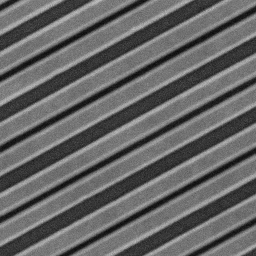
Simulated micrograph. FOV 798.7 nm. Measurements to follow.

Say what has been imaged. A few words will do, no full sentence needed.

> parallel lines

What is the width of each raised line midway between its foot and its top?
17.2 pixels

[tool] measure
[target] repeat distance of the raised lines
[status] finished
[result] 0.0963 microns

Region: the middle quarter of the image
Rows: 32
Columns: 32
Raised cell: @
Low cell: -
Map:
@---------@@@@@@@@@@----@@@@@@@@
---------@@@@@@@@@-----@@@@@@@@-
-------@@@@@@@@@-----@@@@@@@@---
-----@@@@@@@@@-----@@@@@@@@@----
---@@@@@@@@@-----@@@@@@@@@------
-@@@@@@@@@-----@@@@@@@@@--------
@@@@@@@@@----@@@@@@@@@----------
@@@@@@@-----@@@@@@@@----------@@
@@@@@-----@@@@@@@@@---------@@@@
@@@-----@@@@@@@@@---------@@@@@@
@-----@@@@@@@@@----------@@@@@@@
-----@@@@@@@@----------@@@@@@@@-
---@@@@@@@@----------@@@@@@@@@--
-@@@@@@@@----------@@@@@@@@@----
@@@@@@@@----------@@@@@@@@------
@@@@@@----------@@@@@@@@------@@
@@@@----------@@@@@@@@------@@@@
@@@---------@@@@@@@@@-----@@@@@@
@---------@@@@@@@@@-----@@@@@@@@
---------@@@@@@@@-----@@@@@@@@@-
-------@@@@@@@@------@@@@@@@@---
-----@@@@@@@@------@@@@@@@@-----
---@@@@@@@@------@@@@@@@@-------
-@@@@@@@@@-----@@@@@@@@---------
@@@@@@@@-----@@@@@@@@@---------@
@@@@@@------@@@@@@@@---------@@@
@@@@------@@@@@@@@----------@@@@
@@------@@@@@@@@----------@@@@@@
@-----@@@@@@@@----------@@@@@@@@
----@@@@@@@@@---------@@@@@@@@@-
--@@@@@@@@@---------@@@@@@@@@---
@@@@@@@@@---------@@@@@@@@@-----